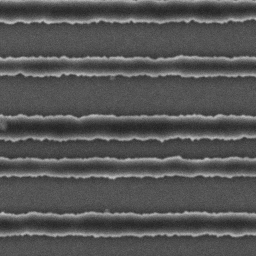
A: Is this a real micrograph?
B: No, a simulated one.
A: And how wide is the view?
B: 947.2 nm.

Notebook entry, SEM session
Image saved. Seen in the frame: lines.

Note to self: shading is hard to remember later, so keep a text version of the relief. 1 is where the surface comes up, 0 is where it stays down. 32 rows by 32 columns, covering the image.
11111111111111111111111111111111
11111111111111111111111111111111
11111111111111111111111111111110
00000000000000000000000000000000
00000000000000000000000000000000
00000000000000000000000000000000
00000000000000000000000000000000
11111111111111111111111111111111
11111111111111111111111111111111
00001100000000001001000111101110
00000000000000000000000000000000
00000000000000000000000000000000
00000000000000000000000000000000
00000000000000000000000000000000
10101001100111000111101111011110
11111111111111111111111111111111
11111111111111111111111111111111
11000001000000000000100000000000
00000000000000000000000000000000
00000000000000000000000000000000
11111111111111111111111111111111
11111111111111111111111111111111
00000000000000000000000000000000
00000000000000000000000000000000
00000000000000000000000000000000
00000000000000000000000000000000
00000000000000000000000000000000
11111111111111111111111111111111
11111111111111111111111111111111
00000000000011100000000000000100
00000000000000000000000000000000
00000000000000000000000000000000